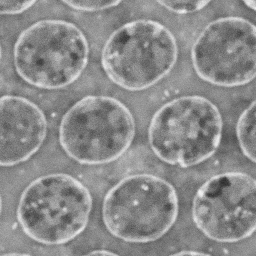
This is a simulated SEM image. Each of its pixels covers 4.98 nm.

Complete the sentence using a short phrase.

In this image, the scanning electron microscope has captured raised bodies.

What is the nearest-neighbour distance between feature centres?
0.431 microns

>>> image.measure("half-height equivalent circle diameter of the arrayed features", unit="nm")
344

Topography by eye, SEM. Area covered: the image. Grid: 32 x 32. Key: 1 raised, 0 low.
11110000011111000000111111000001
10000000000000000000000000000000
00000000000000000000000000001100
00001111100000011111000000111111
00011111110000111111100001111111
00111111111001111111110011111111
00111111111001111111110011111111
00111111111001111111110011111111
00111111110001111111100011111111
00011111110000111111000001111111
00000111000000011110000000001100
00000000000000000000000000000000
11100000001111000000001111000000
11111000011111110000111111100001
11111000111111110000111111100011
11111100111111111001111111110011
11111100111111111001111111100011
11111000111111110001111111100011
11111000111111110001111111100011
11110000011111100000111111000001
00000000000000000000001100000000
00000000000000000000000000000000
00000111100000001111000000111111
00011111111000111111100001111111
00011111111001111111110001111111
00011111111001111111110011111111
00111111111001111111110011111111
00011111111001111111110011111111
00011111110000111111100001111111
00001111100000011111000000111110
00000000000000000000000000000000
00000000000010000000000000000000